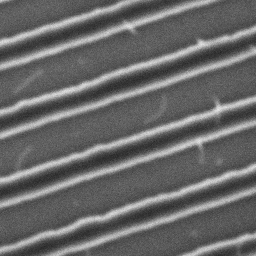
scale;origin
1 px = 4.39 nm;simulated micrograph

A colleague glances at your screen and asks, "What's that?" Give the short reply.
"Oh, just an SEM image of lines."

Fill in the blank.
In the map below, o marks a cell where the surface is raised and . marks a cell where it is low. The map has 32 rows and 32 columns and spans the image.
...............oooooooooo.......
............oooooooooo..........
.........oooooooooo.............
.....ooooooooooo................
..ooooooooooo................ooo
oooooooooo...............ooooooo
ooooooo................ooooooooo
oooo................oooooooooo..
................ooooooooooo.....
.............ooooooooooo........
...........oooooooooo...........
........oooooooooo..............
....oooooooooo.................o
.ooooooooooo...............ooooo
oooooooo.................ooooooo
ooooo.................oooooooooo
oo.................oooooooooo...
................oooooooooo......
............ooooooooooo.........
.........ooooooooooo............
......ooooooooooo...............
...ooooooooooo................oo
oooooooooo.................ooooo
ooooooo................ooooooooo
ooooo...............oooooooooo..
o................oooooooooo.....
..............oooooooooo........
..........ooooooooooo...........
........oooooooooo..............
.....oooooooooo................o
..oooooooooo...............ooooo
oooooooo................oooooooo